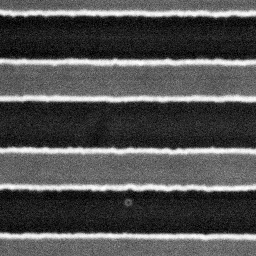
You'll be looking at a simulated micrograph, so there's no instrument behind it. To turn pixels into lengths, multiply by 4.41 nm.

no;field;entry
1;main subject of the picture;lines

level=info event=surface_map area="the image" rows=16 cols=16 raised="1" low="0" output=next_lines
1111111111111111
0000000000000000
0000000000000000
0000000000000000
1111111111111111
1111111111111111
0000000000000000
0000000000000000
0000000000000000
1111111111111111
1111111111111111
1111111111111111
0000000000000000
0000000000000000
0000000000000000
1111111111111111